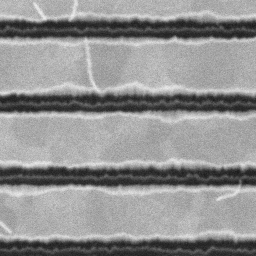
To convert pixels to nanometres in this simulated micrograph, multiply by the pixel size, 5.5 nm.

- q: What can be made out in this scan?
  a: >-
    lines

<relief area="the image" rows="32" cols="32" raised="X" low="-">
XXXXXXXXXXXXXXXXXXXXXXXXXXXXXXXX
XXXXXXXXXXXXXXXXXXXXXXXXXXXXXXXX
---XXX-------------XX------X-X--
--------------------------------
--------------------------------
XXXXXXXXXXXXXXXXXXXXXXXXXXXXXXXX
XXXXXXXXXXXXXXXXXXXXXXXXXXXXXXXX
XXXXXXXXXXXXXXXXXXXXXXXXXXXXXXXX
XXXXXXXXXXXXXXXXXXXXXXXXXXXXXXXX
XXXXXXXXXXXXXXXXXXXXXXXXXXXXXXXX
XXXXXXXXXXXXXXXXXXXXXXXXXXXXXXXX
XXXXXXX---X-XXX---XXXX-XXXXXXXXX
--------------------------------
--------------------------------
XXXXXXXXXXXXXXXXXXXXX-XXXXXXXXXX
XXXXXXXXXXXXXXXXXXXXXXXXXXXXXXXX
XXXXXXXXXXXXXXXXXXXXXXXXXXXXXXXX
XXXXXXXXXXXXXXXXXXXXXXXXXXXXXXXX
XXXXXXXXXXXXXXXXXXXXXXXXXXXXXXXX
XXXXXXXXXXXXXXXXXXXXXXXXXXXXXXXX
XXXXXXXXXXXXXXXXXXXXXXXXXXXXXXXX
--------------------------------
--------------------------------
X-----XXXXXXX------XXXXXXXXXXXXX
XXXXXXXXXXXXXXXXXXXXXXXXXXXXXXXX
XXXXXXXXXXXXXXXXXXXXXXXXXXXXXXXX
XXXXXXXXXXXXXXXXXXXXXXXXXXXXXXXX
XXXXXXXXXXXXXXXXXXXXXXXXXXXXXXXX
XXXXXXXXXXXXXXXXXXXXXXXXXXXXXXXX
XXXXXXXXXXXXXXXXXXXXXXXXXX-XXXXX
--------------------------------
--------------------------------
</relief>